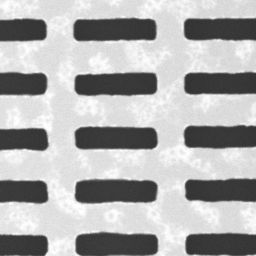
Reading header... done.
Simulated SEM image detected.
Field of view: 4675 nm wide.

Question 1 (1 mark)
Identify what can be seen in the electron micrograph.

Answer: holes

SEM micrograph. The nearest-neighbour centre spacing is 979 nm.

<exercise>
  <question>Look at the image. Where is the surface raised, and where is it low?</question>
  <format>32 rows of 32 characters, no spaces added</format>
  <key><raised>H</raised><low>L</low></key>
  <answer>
HHHHHHHHHHHHHHHHHHHHHHHHHHHHHHHH
HHHHHHHHHHHHHHHHHHHHHHHHHHHHHHHH
LLLLLHHHHHLLLLLLLLLHHHHLLLLLLLLL
LLLLLLHHHLLLLLLLLLLLHHHLLLLLLLLL
LLLLLLHHHLLLLLLLLLLLHHHLLLLLLLLL
HHHHHHHHHHHHHHHHHHHHHHHHHHHHHHHH
HHHHHHHHHHHHHHHHHHHHHHHHHHHHHHHH
HHHHHHHHHHHHHHHHHHHHHHHHHHHHHHHH
HHHHHHHHHHHHHHHHHHHHHHHHHHHHHHHH
LLLLLLHHHHLLLLLLLLLLHHHLLLLLLLLL
LLLLLLHHHLLLLLLLLLLLHHHLLLLLLLLL
LLLLLLHHHLLLLLLLLLLHHHHLLLLLLLLL
HHHHHHHHHHHHHHHHHHHHHHHHHHHHHHHH
HHHHHHHHHHHHHHHHHHHHHHHHHHHHHHHH
HHHHHHHHHHHHHHHHHHHHHHHHHHHHHHHH
HHHHHHHHHHHHHHHHHHHHHHHHHHHHHHHH
LLLLLLHHHLLLLLLLLLLLHHHLLLLLLLLL
LLLLLLHHHLLLLLLLLLLLHHHLLLLLLLLL
LLLLLLHHHHLLLLLLLLLHHHHHLLLLLLLH
HHHHHHHHHHHHHHHHHHHHHHHHHHHHHHHH
HHHHHHHHHHHHHHHHHHHHHHHHHHHHHHHH
HHHHHHHHHHHHHHHHHHHHHHHHHHHHHHHH
LLLLHHHHHHHLLLLLHHHHHHHLLLLLLLLL
LLLLLLHHHLLLLLLLLLLLHHHLLLLLLLLL
LLLLLLHHHLLLLLLLLLLLHHHLLLLLLLLL
HHHHHHHHHHHLHHHHHHHHHHHHHHHHHHHH
HHHHHHHHHHHHHHHHHHHHHHHHHHHHHHHH
HHHHHHHHHHHHHHHHHHHHHHHHHHHHHHHH
HHHHHHHHHHHHHHHHHHHHHHHHHHHHHHHH
LLLLLLHHHHLLLLLLLLLHHHHHLLLLLLLL
LLLLLLHHHLLLLLLLLLLLHHHLLLLLLLLL
LLLLLLHHHLLLLLLLLLLLHHHLLLLLLLLL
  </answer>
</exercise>